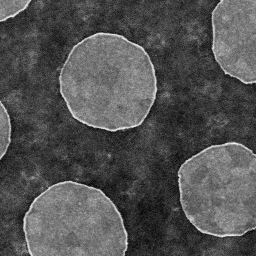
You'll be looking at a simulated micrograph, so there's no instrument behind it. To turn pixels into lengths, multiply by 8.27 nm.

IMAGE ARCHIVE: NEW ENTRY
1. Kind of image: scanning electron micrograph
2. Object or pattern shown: raised bodies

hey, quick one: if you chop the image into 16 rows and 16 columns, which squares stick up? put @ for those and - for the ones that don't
@------------@@@
-------------@@@
-----@@@-----@@@
----@@@@@----@@@
----@@@@@@----@@
----@@@@@@------
----@@@@@@------
@----@@@@-------
@---------------
-------------@@@
-----------@@@@@
----@------@@@@@
--@@@@@----@@@@@
--@@@@@@----@@@@
--@@@@@@-----@@-
--@@@@@@--------